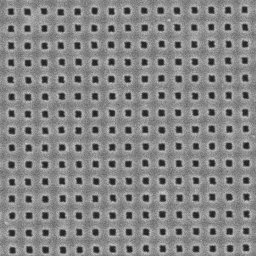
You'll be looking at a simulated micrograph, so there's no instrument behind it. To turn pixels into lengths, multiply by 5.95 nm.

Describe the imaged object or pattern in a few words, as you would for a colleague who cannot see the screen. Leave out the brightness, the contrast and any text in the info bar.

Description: a regular array of holes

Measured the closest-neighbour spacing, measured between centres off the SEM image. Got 97.2 nm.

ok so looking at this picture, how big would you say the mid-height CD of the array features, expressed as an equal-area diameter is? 43.5 nm